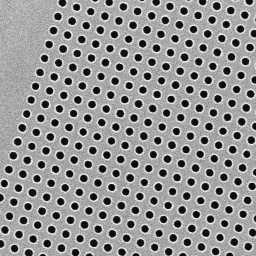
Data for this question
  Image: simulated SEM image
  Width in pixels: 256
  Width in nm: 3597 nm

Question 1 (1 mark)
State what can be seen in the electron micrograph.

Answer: a regular array of holes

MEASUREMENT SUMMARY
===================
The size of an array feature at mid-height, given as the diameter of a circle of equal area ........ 103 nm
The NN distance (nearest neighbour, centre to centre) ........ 14.5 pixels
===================